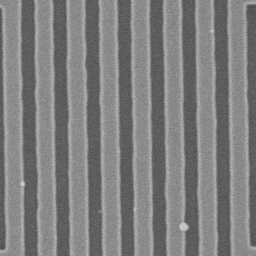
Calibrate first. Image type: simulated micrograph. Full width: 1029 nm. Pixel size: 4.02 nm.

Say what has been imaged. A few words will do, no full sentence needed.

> groups of lines, slits or small figures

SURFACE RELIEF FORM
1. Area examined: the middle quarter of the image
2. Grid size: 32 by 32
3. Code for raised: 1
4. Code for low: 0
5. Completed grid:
01111000011110000111100001111000
01111000011110000111100001111100
01111000011110000111100001111100
01111000011110000111100001111100
01111000011110000111110001111100
01111000011110000111110001111100
01111100011110000111110001111100
01111100011110000111110001111100
01111100011110000111110001111100
01111100011110000111110001111100
01111000011110000111110001111000
01111000011110000111110001111100
01111000011110000111110001111100
01111000011110000111110001111100
01111000011111000011110001111100
01111000011111000111110001111100
01111100011111000111110001111100
01111100011111000111110001111100
01111100011111000111110001111100
01111100011110000111110001111100
01111100011111000011110001111100
01111100011111000011110000111100
01111100011111000011110000111100
01111100011111000111110000111100
01111100011111000111110000111100
01111100011111000111110000111100
01111100011111000111110000111100
01111100011111000011110000111100
01111100011111000011110000111100
01111100001111000011110000111100
01111100001111000011110001111100
01111100001111000011110001111100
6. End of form